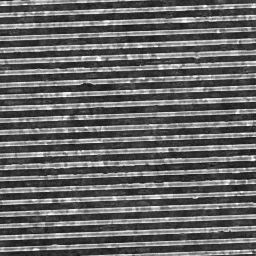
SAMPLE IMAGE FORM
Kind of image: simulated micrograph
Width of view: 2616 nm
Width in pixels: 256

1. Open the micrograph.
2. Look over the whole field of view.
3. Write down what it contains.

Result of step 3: parallel lines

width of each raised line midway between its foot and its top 38.3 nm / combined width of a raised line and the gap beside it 120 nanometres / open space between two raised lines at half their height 86.8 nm